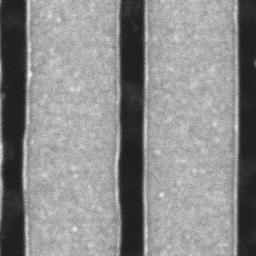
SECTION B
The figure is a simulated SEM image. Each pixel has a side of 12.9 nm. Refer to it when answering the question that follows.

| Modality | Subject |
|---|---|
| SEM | one or a few lines or trenches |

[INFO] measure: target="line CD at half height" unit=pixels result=28.9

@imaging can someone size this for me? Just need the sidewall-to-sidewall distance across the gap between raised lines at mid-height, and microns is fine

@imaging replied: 1.15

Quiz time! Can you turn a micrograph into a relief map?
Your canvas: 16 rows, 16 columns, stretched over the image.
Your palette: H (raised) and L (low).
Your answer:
HHLLLLLHHLLLLLLH
HHLLLLLHHLLLLLLH
HHLLLLLHHLLLLLLH
HHLLLLLHHLLLLLLH
HHLLLLLHHLLLLLLH
HHLLLLLHHLLLLLLH
HHLLLLLHHLLLLLLH
HHLLLLLHHLLLLLLH
HHLLLLLHHLLLLLLH
HHLLLLLHHLLLLLLH
HHLLLLLHHLLLLLLH
HHLLLLLHHLLLLLLH
HHLLLLLHHLLLLLLH
HHLLLLLHHLLLLLLH
HHLLLLLHHLLLLLLH
HHLLLLLHHLLLLLLH